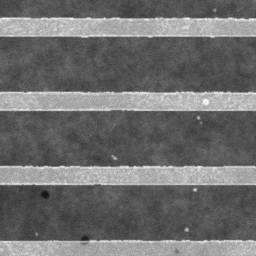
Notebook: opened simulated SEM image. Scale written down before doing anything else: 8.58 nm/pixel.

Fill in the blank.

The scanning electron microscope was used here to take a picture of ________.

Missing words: lines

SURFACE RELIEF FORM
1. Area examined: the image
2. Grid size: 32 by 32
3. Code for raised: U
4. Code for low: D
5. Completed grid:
DDDDDDDDDDDDDDDDDDDDDDDDDDDDDDDD
DDDDDDDDDDDDDDDDDDDDDDDDDDDDDDDD
UUUUUUUUUUUUUUUUUUUUUUUUUUUUUUUU
UUUUUUUUUUUUUUUUUUUUUUUUUUUUUUUU
DDDDDDDDDDDDDDDDDDDDDDDDDDDDDDDD
DDDDDDDDDDDDDDDDDDDDDDDDDDDDDDDD
DDDDDDDDDDDDDDDDDDDDDDDDDDDDDDDD
DDDDDDDDDDDDDDDDDDDDDDDDDDDDDDDD
DDDDDDDDDDDDDDDDDDDDDDDDDDDDDDDD
DDDDDDDDDDDDDDDDDDDDDDDDDDDDDDDD
DDDDDDDDDDDDDDDDDDDDDDDDDDDDDDDD
DDDDDDDDDDDDDDDDDDDDDDDDDDDDDDDD
UUUUUUUUUUUUUUUUUUUUUUUUUUUUUUUU
UUUUUUUUUUUUUUUUUUUUUUUUUUUUUUUU
DDDDDDDDDDDDDDDDDDDDDDDDDDDDDDDD
DDDDDDDDDDDDDDDDDDDDDDDDDDDDDDDD
DDDDDDDDDDDDDDDDDDDDDDDDDDDDDDDD
DDDDDDDDDDDDDDDDDDDDDDDDDDDDDDDD
DDDDDDDDDDDDDDDDDDDDDDDDDDDDDDDD
DDDDDDDDDDDDDDDDDDDDDDDDDDDDDDDD
DDDDDDDDDDDDDDDDDDDDDDDDDDDDDDDD
UUUUUUUUUUUUUUUUUUUUUUUUUUUUUUUU
UUUUUUUUUUUUUUUUUUUUUUUUUUUUUUUU
DDDDDDDDDDDDDDDDDDDDDDDDDDDDDDDD
DDDDDDDDDDDDDDDDDDDDDDDDDDDDDDDD
DDDDDDDDDDDDDDDDDDDDDDDDDDDDDDDD
DDDDDDDDDDDDDDDDDDDDDDDDDDDDDDDD
DDDDDDDDDDDDDDDDDDDDDDDDDDDDDDDD
DDDDDDDDDDDDDDDDDDDDDDDDDDDDDDDD
DDDDDDDDDDDDDDDDDDDDDDDDDDDDDDDD
UUUUUUUUUUUUUUUUUUUUUUUUUUUUUUUU
UUUUUUUUUUUUUUUUUUUUUUUUUUUUUUUU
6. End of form